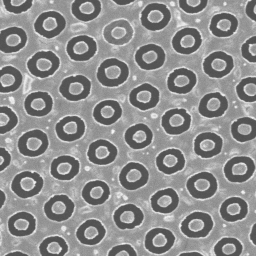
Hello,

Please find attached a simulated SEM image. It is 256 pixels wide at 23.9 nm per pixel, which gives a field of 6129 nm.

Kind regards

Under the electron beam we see a regular array of ring-shaped grooves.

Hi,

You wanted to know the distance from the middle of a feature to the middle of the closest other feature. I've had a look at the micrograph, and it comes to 948 nm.